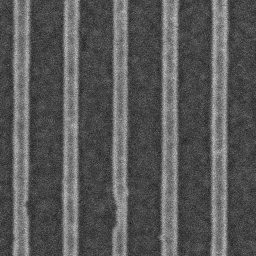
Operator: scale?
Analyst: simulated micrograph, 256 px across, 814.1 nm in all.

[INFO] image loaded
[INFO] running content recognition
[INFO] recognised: parallel lines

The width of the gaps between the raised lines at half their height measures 117 nanometres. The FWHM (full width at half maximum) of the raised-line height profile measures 40.2 nm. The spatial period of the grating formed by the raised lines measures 158 nm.